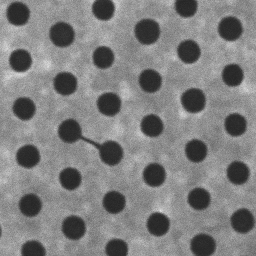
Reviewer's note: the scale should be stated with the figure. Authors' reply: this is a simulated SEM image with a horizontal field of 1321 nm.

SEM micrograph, a regular array of holes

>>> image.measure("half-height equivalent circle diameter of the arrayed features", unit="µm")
0.114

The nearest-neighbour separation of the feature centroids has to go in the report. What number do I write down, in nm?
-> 243